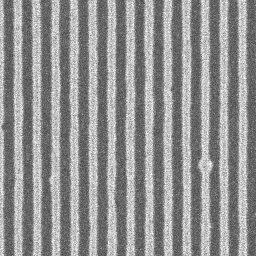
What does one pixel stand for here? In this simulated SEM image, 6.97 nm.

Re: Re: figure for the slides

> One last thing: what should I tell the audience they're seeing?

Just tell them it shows parallel lines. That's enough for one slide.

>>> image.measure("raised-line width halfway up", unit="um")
0.0671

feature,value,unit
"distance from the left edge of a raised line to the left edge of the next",0.13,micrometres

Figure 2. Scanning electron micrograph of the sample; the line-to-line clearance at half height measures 67.1 nm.